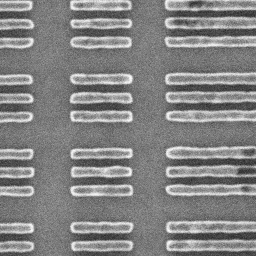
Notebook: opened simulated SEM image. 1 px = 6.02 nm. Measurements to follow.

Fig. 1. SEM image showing wiring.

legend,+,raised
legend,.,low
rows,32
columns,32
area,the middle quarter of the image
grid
................................
................................
................................
..+++++++++++++++.........++++++
..++++++++++++++..........++++++
................................
................................
...+++++++++.+++..........++++++
..+++++++++++++++.........++++++
..++++++++...++++.........++++++
................................
................................
..+++++++++++++++.........++++++
..+++++++++++++++.........++++++
................................
................................
................................
................................
................................
................................
................................
...++++++++++++++.........++++++
..+++++++++++++++.........++++++
..++++++++..++.............++++.
................................
................................
..+++++++++++++++.........++++++
..+++++++++++++++.........++++++
................................
................................
..........++++++...........++++.
..+++++++++++++++.........++++++